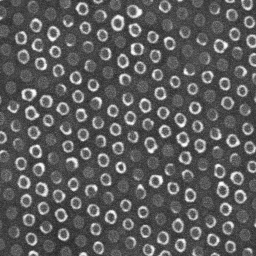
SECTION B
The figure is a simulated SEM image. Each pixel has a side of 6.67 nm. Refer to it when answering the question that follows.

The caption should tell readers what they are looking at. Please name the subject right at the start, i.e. a regular array of raised bodies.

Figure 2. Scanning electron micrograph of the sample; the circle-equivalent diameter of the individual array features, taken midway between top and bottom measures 76.4 nanometres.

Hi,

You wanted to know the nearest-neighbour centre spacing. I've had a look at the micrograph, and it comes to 0.124 µm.